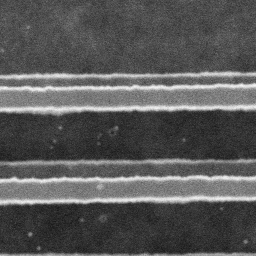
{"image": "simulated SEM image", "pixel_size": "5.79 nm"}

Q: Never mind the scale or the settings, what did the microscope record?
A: lines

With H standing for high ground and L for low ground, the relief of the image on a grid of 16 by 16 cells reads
LLLLLLLLLLLLLLLL
LLLLLLLLLLLLLLLL
LLLLLLLLLLLLLLLL
LLLLLLLLLLLLLLLL
LLLLLLLLLLLLLLLL
HHHHHHHHHHHHHHHH
HHHHHHHHHHHHHHHH
LLLLLLLLLLLLLLLL
LLLLLLLLLLLLLLLL
LLLLLLLLLLLLLLLL
HHHHHHHHHHHHHHHH
HHHHHHHHHHHHHHHH
HHHHHHHHHHHHLHLL
LLLLLLLLLLLLLLLL
LLLLLLLLLLLLLLLL
LLLLLLLLLLLLLLLL